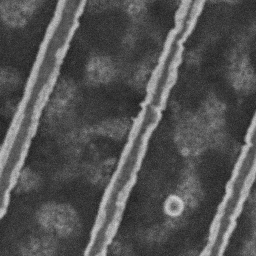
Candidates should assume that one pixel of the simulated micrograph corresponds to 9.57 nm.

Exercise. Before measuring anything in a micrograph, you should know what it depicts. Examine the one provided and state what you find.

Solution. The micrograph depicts one or a few lines or trenches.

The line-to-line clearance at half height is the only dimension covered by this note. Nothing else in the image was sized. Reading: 0.892 microns